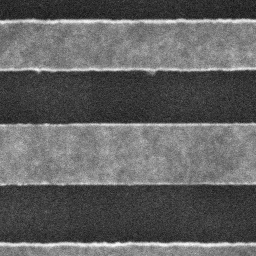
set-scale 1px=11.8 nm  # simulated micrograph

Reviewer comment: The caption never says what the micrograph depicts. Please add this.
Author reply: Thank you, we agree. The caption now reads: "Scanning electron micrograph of lines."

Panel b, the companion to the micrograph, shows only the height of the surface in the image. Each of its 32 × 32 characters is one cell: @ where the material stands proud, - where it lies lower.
--------------------------------
--------------------------------
----------------------@---------
@@@@@@@@@@@@@@@@@@@@@@@@@@@@@@@@
@@@@@@@@@@@@@@@@@@@@@@@@@@@@@@@@
@@@@@@@@@@@@@@@@@@@@@@@@@@@@@@@@
@@@@@@@@@@@@@@@@@@@@@@@@@@@@@@@@
@@@@@@@@@@@@@@@@@@@@@@@@@@@@@@@@
@@@@@@@@@@@@@@@@@@@@@@@@@@@@@@@@
--------------------------------
--------------------------------
--------------------------------
--------------------------------
--------------------------------
--------------------------------
-------------------------------@
@@@@@@@@@@@@@@@@@@@@@@@@@@@@@@@@
@@@@@@@@@@@@@@@@@@@@@@@@@@@@@@@@
@@@@@@@@@@@@@@@@@@@@@@@@@@@@@@@@
@@@@@@@@@@@@@@@@@@@@@@@@@@@@@@@@
@@@@@@@@@@@@@@@@@@@@@@@@@@@@@@@@
@@@@@@@@@@@@@@@@@@@@@@@@@@@@@@@@
@@@@@@@@@@@@@@@@@@@@@@@@@@@@@@@@
--------------------------------
--------------------------------
--------------------------------
--------------------------------
--------------------------------
--------------------------------
--------------------------------
@@@@@-@@@@@@@@@@@@@@@@@@@@@@@@@@
@@@@@@@@@@@@@@@@@@@@@@@@@@@@@@@@